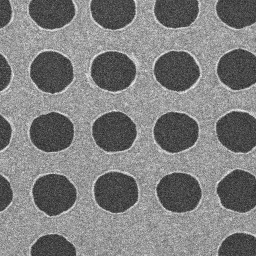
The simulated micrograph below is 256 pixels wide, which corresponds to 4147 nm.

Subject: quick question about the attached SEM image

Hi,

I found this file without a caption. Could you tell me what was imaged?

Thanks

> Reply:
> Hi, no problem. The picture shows a regular array of holes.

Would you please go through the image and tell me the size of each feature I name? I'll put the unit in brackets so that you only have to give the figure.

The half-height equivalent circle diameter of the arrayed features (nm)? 702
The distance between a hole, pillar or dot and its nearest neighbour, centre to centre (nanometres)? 980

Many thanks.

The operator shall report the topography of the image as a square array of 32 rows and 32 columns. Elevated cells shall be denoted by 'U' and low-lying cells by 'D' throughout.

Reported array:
DUUUDDDDDUUDDDDDDUUDDDDDDUUDDDDD
DDUUDDDDDDUDDDDDDUUDDDDDDUUDDDDD
DUUUDDDDDUUUDDDDDUUUDDDDUUUUDDDD
UUUUUDDDUUUUUDDUUUUUUDUUUUUUUDDU
UUUUUUUUUUUUUUUUUUUUUUUUUUUUUUUU
UUUUUUUUUUUUUUUUUUUUUUUUUUUUUUUU
UUUUUDDUUUUUUDDUUUUUUDDUUUUUDDDU
DUUUDDDDDUUUDDDDUUUUDDDDUUUDDDDD
DUUUDDDDDUUDDDDDDUUDDDDDDUUDDDDD
DDUUDDDDDUUDDDDDDUUDDDDDDUUDDDDD
DUUUDDDDDUUUDDDDUUUUDDDDUUUUDDDD
UUUUUDDDUUUUUUUUUUUUUUDUUUUUUUUU
UUUUUUUUUUUUUUUUUUUUUUUUUUUUUUUU
UUUUUUUUUUUUUUUUUUUUUUUUUUUUUUUU
UUUUUDDDUUUUUDDDUUUUDDDDUUUUDDDD
DUUUDDDDDUUUDDDDDUUDDDDDDUUDDDDD
DDUUDDDDDUUUDDDDDUUDDDDDDUUDDDDD
DUUUDDDDDUUUDDDDDUUDDDDDDUUDDDDD
DUUUUDDDUUUUDDDDUUUUDDDDUUUUDDDD
UUUUUUUUUUUUUUUUUUUUUUUUUUUUUUUU
UUUUUUUUUUUUUUUUUUUUUUUUUUUUUUUU
UUUUUUUUUUUUUUDUUUUUUUUUUUUUUDDU
DUUUDDDDDUUUDDDDDUUUDDDDDUUUDDDD
DUUUDDDDDUUUDDDDDUUUDDDDDUUDDDDD
DDUUDDDDDDUUDDDDDUUUDDDDDUUDDDDD
DUUUDDDDDUUUDDDDDUUUDDDDDUUUDDDD
UUUUUDDDUUUUUUDUUUUUUDDUUUUUUUDU
UUUUUUUUUUUUUUUUUUUUUUUUUUUUUUUU
UUUUUUUUUUUUUUUUUUUUUUUUUUUUUUUU
UUUUUDDDUUUUUUUUUUUUUUUUUUUUUDDD
UUUUDDDDDUUUUUUUUUUUUUUUUUUUDDDD
UUUUDDDDDUUUUUUUUUUUUUUUUUUDDDDD